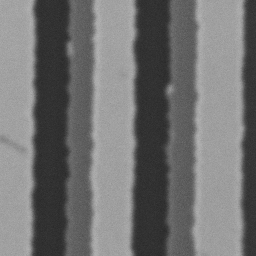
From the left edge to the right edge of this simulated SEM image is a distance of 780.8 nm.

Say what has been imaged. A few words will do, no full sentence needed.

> lines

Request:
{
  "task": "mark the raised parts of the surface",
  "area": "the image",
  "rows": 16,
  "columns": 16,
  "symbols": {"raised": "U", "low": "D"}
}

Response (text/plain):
UUDDUUUUDDDUUUUD
UUDDUUUUDDDUUUUD
UUDDUUUUDDDUUUUD
UUDDUUUUDDDUUUUD
UUDDUUUUDDDUUUUD
UUDDUUUUDDDUUUUD
UUDDUUUUDDDUUUUD
UUDDUUUUDDDUUUUD
UUDDUUUUDDDUUUUD
UUDDUUUUDDDUUUUD
UUDDUUUUDDDUUUUD
UUDDUUUUDDDUUUUD
UUDDUUUUDDDUUUUD
UUDDUUUUDDDUUUUD
UUDDUUUUDDDUUUUD
UUDDUUUUDDDUUUUD